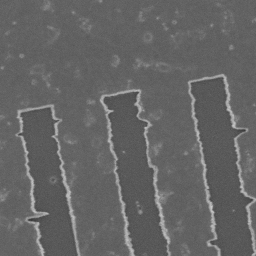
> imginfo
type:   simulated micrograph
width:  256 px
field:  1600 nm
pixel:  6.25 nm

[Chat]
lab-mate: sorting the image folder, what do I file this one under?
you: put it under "one or a few lines or trenches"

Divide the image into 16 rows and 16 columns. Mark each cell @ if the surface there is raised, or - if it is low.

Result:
@@@@@@@@@@@@@@@@
@@@@@@@@@@@@@@@@
@@@@@@@@@@@@@@@@
@@@@@@@@@@@@@@@@
@@@@@@@@@@@@@@@@
@@@@@@@@@@@@--@@
@@@@@@@--@@@--@@
@--@@@@--@@@---@
@---@@@--@@@---@
@@--@@@--@@@@--@
@@--@@@---@@@--@
@@--@@@---@@@--@
@@--@@@@--@@@---
@@--@@@@--@@@---
@@---@@@--@@@---
@@@--@@@--@@@---